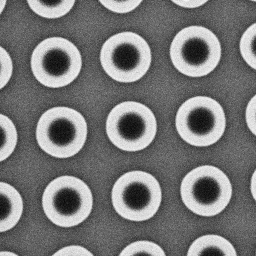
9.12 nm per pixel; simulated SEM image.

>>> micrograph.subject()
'an array of small figures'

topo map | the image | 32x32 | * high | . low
*...*****....****.....***.......
....****.......*................
................................
.......................**......*
..............***.....*****...**
.....****....*****....*****...**
*...******...******..*******..**
*...******...******...*****....*
*...******...******...*****.....
*...******....****......*.......
*....***........................
................................
........................***....*
.......*......****.....*****...*
*....*****....*****...******...*
**...******..******...******...*
**...******..******...******....
**...******...*****....****.....
**...*****.....***..............
*......**.......................
................................
.................*......****....
.......***.....****....******..*
**....*****...******...******..*
**...******...******...******...
***..******...******...*****....
***...*****....****.....***.....
**....****.......*..............
*...............................
..........................*.....
................***.....*****...
*......****....*****....*****...